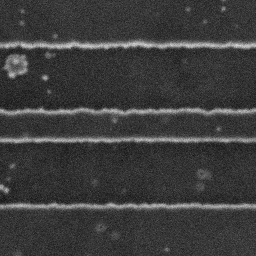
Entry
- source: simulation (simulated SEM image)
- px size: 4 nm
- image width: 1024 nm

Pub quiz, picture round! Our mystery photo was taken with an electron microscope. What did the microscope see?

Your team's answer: lines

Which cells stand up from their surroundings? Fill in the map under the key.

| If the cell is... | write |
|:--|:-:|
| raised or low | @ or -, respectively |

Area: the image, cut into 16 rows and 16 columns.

@@@@@@@@@@@@@@@@
@@@@@@@@@@@@@@@@
@@@@@@@@@@@@@@@@
----------------
----------------
----------------
----------------
@@@@@@@@@@@@@@@@
@@@@@@@@@@@@@@@@
----------------
----------------
----------------
----------------
@@@@@@@@@@@@@@@@
@@@@@@@@@@@@@@@@
@@@@@@@@@@@@@@@@